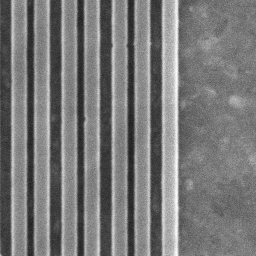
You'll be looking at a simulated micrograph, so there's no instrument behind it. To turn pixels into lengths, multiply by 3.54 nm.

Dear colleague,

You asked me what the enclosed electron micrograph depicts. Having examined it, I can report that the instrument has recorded parallel lines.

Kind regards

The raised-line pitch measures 88.7 nanometres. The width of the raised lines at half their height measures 52.6 nm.